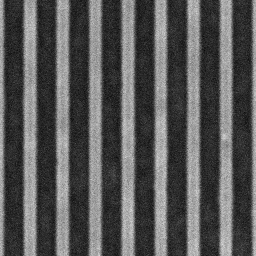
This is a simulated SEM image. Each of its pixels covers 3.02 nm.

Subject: parallel lines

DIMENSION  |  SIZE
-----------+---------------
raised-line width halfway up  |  34.4 nanometres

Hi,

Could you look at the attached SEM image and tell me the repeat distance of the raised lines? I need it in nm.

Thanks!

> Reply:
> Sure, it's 98.7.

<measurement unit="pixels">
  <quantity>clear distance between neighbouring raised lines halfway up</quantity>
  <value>21.8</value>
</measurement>